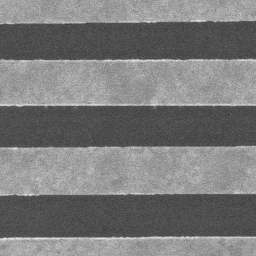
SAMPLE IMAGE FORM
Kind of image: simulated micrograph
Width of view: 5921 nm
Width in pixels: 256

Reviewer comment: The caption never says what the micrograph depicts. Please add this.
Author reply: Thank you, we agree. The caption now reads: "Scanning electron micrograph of lines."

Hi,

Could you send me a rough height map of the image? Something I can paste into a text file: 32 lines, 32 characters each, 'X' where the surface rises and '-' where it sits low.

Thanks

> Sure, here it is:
XXXXXXXXXXXXXXXXXXXXXXXXXXXXXXXX
XXXXXXXXXXXXXXXXXXXXXXXXXXXXXXXX
XXXXXXXXXXXXXXXXXXXXXXXXXXXXXXXX
--------------------------------
--------------------------------
--------------------------------
--------------------------------
--------------------------------
XXXXXXXXXXXXXXXXXXXXXXXXXXXXXXXX
XXXXXXXXXXXXXXXXXXXXXXXXXXXXXXXX
XXXXXXXXXXXXXXXXXXXXXXXXXXXXXXXX
XXXXXXXXXXXXXXXXXXXXXXXXXXXXXXXX
XXXXXXXXXXXXXXXXXXXXXXXXXXXXXXXX
--------------------------------
--------------------------------
--------------------------------
--------------------------------
--------------------------------
------X----XXXXXXXXXXXXXXXXXXXXX
XXXXXXXXXXXXXXXXXXXXXXXXXXXXXXXX
XXXXXXXXXXXXXXXXXXXXXXXXXXXXXXXX
XXXXXXXXXXXXXXXXXXXXXXXXXXXXXXXX
XXXXXXXXXXXXXXXXXXXXXXXXXXXXXXXX
XXXXXXXXXXXXXXXXXXXXXXXXXXXXXXXX
--------------------------------
--------------------------------
--------------------------------
--------------------------------
--------------------------------
--------------------------------
XXXXXXXXXXXXXXXXXXXXXXXXXXXXXXXX
XXXXXXXXXXXXXXXXXXXXXXXXXXXXXXXX